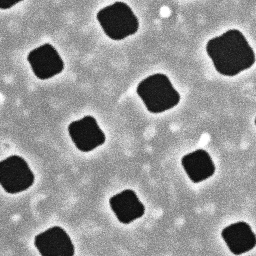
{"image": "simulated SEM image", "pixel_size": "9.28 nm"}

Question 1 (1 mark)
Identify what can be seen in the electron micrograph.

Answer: holes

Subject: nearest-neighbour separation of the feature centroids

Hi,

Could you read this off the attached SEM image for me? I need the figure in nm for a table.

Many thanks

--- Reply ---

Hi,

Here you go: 764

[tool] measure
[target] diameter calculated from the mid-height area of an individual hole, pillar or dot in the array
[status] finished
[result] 325 nanometers